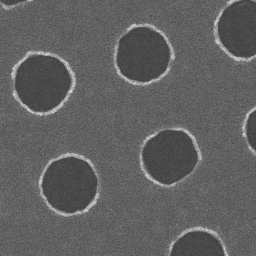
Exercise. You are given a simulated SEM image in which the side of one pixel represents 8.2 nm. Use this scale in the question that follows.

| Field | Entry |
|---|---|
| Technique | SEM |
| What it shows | holes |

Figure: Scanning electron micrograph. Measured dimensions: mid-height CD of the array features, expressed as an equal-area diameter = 54.8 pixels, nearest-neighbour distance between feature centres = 853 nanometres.